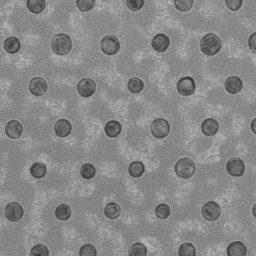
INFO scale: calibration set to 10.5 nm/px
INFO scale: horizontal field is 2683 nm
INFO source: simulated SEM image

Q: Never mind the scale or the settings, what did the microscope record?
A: a regular array of holes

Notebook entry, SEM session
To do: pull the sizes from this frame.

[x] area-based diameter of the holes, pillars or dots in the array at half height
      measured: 0.194 micrometres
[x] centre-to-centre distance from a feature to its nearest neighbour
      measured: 496 nm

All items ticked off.